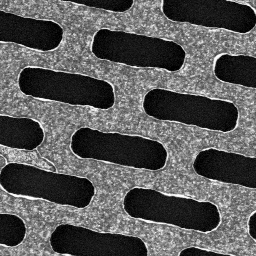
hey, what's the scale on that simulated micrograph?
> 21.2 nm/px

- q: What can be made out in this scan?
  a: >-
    holes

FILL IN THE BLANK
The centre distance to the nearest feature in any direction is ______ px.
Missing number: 80.4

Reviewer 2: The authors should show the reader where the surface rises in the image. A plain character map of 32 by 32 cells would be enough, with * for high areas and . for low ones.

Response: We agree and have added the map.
**********.......***..........**
.*******************............
......***************...........
........*******************.....
........****......**************
**.....*****..........**********
************...........*********
*************..........****.....
***..***************...****.....
**.........****************.....
**............***************...
***...........*****...**********
******........****..........****
************..****............**
.******************...........**
.....******************.......**
.....****....*******************
.....****..........*************
*...*****............***********
**********...........****......*
*...**********.......***........
.......******************.......
...........****************.....
............*****.*************.
**..........****.......*********
*******....****............*****
****************...........*****
...***************..........***.
...****....************....****.
...***..........***************.
..****............**************
*******...........*****....*****